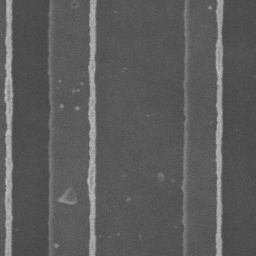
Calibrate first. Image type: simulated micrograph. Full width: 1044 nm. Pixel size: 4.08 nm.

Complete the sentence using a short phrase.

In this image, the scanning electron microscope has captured lines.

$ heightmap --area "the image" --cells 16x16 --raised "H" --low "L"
HLLHHHLLLLLLHHLL
HLLHHHLLLLLLHHLL
HLLHHHLLLLLLHHLL
HLLHHHLLLLLLHHLL
HLLHHHLLLLLLHHLL
HLLHHHLLLLLHHHLL
HLLHHHLLLLLLHHLL
HLLHHHLLLLLLHHLL
HLLHHHLLLLLLHHLL
HLLHHHLLLLLHHHLL
HLLHHHLLLLLHHHLL
HLLHHHLLLLLHHHLL
HLLHHHLLLLLHHHLL
HLLHHHLLLLLHHHLL
HLLHHHLLLLLHHHLL
HLLHHHLLLLLHHHLL